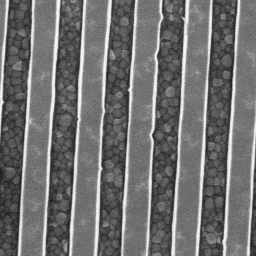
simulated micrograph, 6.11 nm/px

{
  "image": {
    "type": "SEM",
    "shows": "parallel lines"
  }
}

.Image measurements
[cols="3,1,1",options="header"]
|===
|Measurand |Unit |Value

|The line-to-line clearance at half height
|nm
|162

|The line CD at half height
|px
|24.8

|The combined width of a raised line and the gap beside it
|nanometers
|312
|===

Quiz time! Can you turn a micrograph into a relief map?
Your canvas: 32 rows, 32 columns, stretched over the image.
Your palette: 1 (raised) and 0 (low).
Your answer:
10001110000111000111000111000011
10001110000111000111000111000011
10001110001111000111000111000011
10001110001111000111000111000011
10001110001110000111000111000011
10001110001110000111000111000111
10001110001110000111000111000011
00001110001110000111000111000111
00001110001110000111000111000111
00001110001110001111000111000111
00001110001110001110000111000111
00001110001110001110000111000111
00001110001110001110000111000111
00011110001110001110000111000111
00011100001110001110000111000111
00011100001110001110000111000111
00011100001110001110000111000111
00011100001110001110001110000111
00011100001110001110001110000111
00011100001110001110001110000111
00011100001110001110001110000111
00011100011100001110001110000111
00011100011100001110001110001110
00011100011100001110001110001110
00011100011100001110001110001110
00011100011100001110001110001110
00011100011100001110001110001110
00011100011100011110001110001110
00011100011100011110001110001110
00111100011100011100001110001110
00111100011100011100001110001110
00111000011100011100001110001110